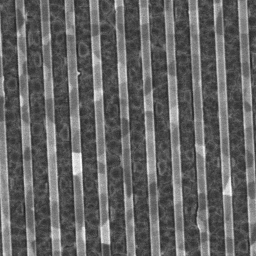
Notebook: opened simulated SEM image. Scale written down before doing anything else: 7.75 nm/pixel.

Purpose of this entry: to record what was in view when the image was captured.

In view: parallel lines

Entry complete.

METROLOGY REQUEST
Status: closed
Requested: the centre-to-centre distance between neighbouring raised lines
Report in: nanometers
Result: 192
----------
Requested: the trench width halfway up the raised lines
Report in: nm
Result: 124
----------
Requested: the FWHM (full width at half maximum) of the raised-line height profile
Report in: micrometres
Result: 0.0649